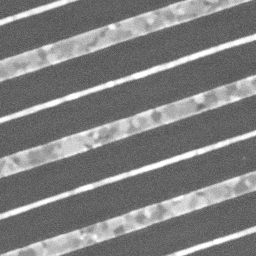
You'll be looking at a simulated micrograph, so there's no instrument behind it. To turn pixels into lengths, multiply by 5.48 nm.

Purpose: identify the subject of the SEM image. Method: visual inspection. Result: lines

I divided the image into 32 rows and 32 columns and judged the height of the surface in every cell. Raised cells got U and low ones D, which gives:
DDDDDDDDDDDDDDDDDDDDDDUUUUUUUUDD
DDDDDDDDDDDDDDDDDDDUUUUUUUUDDDDD
DDDDDDDDDDDDDDDDUUUUUUUUDDDDDDDD
DDDDDDDDDDDDDUUUUUUUUDDDDDDDDDDD
DDDDDDDDDDUUUUUUUDDDDDDDDDDDDDDD
DDDDDDDUUUUUUUDDDDDDDDDDDDDDDDDD
DDDUUUUUUUUDDDDDDDDDDDDDDDDDDDDD
DUUUUUUUDDDDDDDDDDDDDDDDDDDDDDDD
UUUUUDDDDDDDDDDDDDDDDDDDDDDDDDDD
UUDDDDDDDDDDDDDDDDDDDDDDDDDDDDDD
DDDDDDDDDDDDDDDDDDDDDDDDDDDDDUUU
DDDDDDDDDDDDDDDDDDDDDDDDDDUUUUUU
DDDDDDDDDDDDDDDDDDDDDDDUUUUUUUDD
DDDDDDDDDDDDDDDDDDDDUUUUUUUDDDDD
DDDDDDDDDDDDDDDDDUUUUUUUDDDDDDDD
DDDDDDDDDDDDDDUUUUUUUDDDDDDDDDDD
DDDDDDDDDDDUUUUUUUDDDDDDDDDDDDDD
DDDDDDDUUUUUUUUDDDDDDDDDDDDDDDDD
DDDDUUUUUUUUDDDDDDDDDDDDDDDDDDDD
DUUUUUUUUDDDDDDDDDDDDDDDDDDDDDDD
UUUUUDDDDDDDDDDDDDDDDDDDDDDDDDDD
UUDDDDDDDDDDDDDDDDDDDDDDDDDDDDDD
DDDDDDDDDDDDDDDDDDDDDDDDDDDDDUUU
DDDDDDDDDDDDDDDDDDDDDDDDDDUUUUUU
DDDDDDDDDDDDDDDDDDDDDDDUUUUUUUDD
DDDDDDDDDDDDDDDDDDDDUUUUUUUDDDDD
DDDDDDDDDDDDDDDDUUUUUUUUDDDDDDDD
DDDDDDDDDDDDDDUUUUUUUDDDDDDDDDDD
DDDDDDDDDDDUUUUUUUDDDDDDDDDDDDDD
DDDDDDDDUUUUUUUDDDDDDDDDDDDDDDDD
DDDDUUUUUUUUDDDDDDDDDDDDDDDDDDDD
DUUUUUUUUDDDDDDDDDDDDDDDDDDDDDDD